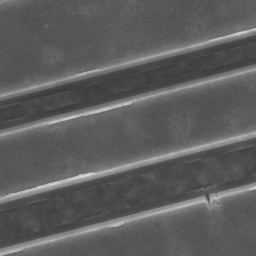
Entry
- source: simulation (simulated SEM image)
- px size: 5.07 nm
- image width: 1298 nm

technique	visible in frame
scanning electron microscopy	one or a few lines or trenches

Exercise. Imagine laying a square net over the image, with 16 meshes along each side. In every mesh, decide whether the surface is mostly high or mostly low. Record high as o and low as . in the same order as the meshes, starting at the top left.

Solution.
oooooooooooooooo
oooooooooooooooo
oooooooooooooo..
oooooooooo......
oooooo.........o
ooo........ooooo
.......ooooooooo
...ooooooooooooo
oooooooooooooooo
oooooooooooo....
oooooooo........
oooo............
.............ooo
.........ooooooo
.....ooooooooooo
.ooooooooooooooo